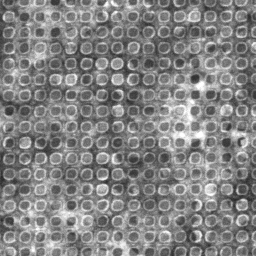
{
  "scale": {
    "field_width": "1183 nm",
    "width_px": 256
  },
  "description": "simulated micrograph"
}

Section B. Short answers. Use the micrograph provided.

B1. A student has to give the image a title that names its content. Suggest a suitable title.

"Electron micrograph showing a regular array of raised bodies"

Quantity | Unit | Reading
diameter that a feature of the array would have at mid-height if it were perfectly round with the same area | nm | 52.9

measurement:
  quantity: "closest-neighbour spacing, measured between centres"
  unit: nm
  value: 70.6